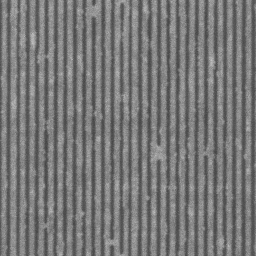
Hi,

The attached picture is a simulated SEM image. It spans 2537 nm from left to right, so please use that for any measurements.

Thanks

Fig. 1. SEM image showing parallel lines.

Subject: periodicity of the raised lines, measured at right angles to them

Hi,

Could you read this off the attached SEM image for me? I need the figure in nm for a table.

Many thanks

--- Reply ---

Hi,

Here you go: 93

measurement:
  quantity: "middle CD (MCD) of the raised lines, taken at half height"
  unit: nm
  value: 50.8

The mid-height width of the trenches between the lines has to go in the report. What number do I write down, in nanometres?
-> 42.1